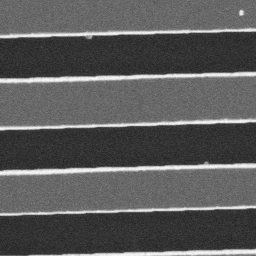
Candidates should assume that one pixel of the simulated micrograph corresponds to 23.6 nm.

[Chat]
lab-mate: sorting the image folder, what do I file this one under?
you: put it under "lines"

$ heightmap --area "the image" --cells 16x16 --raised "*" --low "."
****************
****************
................
................
................
****************
****************
****************
................
................
.......*********
****************
****************
................
................
................